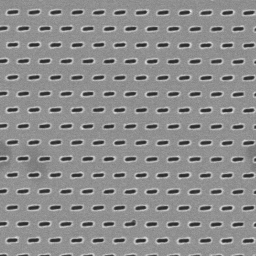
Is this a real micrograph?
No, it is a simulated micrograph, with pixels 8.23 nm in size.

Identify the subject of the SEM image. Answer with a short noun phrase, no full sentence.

a regular array of holes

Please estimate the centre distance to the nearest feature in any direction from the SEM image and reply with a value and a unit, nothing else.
158 nanometres